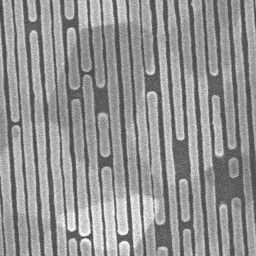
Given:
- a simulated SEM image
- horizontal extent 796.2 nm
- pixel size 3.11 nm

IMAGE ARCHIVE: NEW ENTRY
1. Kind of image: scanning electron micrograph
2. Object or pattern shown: parallel lines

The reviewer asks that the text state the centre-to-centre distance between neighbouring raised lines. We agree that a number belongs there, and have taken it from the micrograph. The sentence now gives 39.3 nanometers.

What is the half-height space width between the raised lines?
13.6 nm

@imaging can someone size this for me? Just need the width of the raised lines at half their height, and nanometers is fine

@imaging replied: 26.7